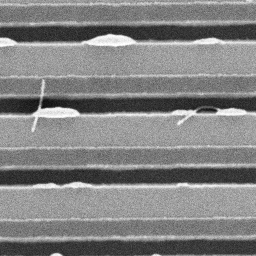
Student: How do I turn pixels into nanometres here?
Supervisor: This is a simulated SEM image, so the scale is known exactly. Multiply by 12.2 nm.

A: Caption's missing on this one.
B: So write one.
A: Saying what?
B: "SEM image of lines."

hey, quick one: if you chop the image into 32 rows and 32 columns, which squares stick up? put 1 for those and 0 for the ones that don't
11111111111111111111111111111111
11111111111111111111111111111111
11111111111111111111111111111111
00000000000000000000000000000000
00000000000001110000000000000000
11100001011111111111111111111111
11111111111111111111111111111111
11111111111111111111111111111111
11111111111111111111111111111111
11111111111111111111111111111111
11111111111111111111111111111111
11111111111111111111111111111111
00000000000000000000000000000000
00000111000000000000000000000000
11101111111111111111111111111111
11111111111111111111111111111111
11111111111111111111111111111111
11111111111111111111111111111111
11111111111111111111111111111111
11111111111111111111111111111111
11111111111111111111111111111111
00000000000000000000000000000000
00000000000000000000000000000000
11111111111111111111111111111111
11111111111111111111111111111111
11111111111111111111111111111111
11111111111111111111111111111111
11111111111111111111111111111111
11111111111111111111111111111111
11111111111111111111111111111111
00000000000000000000000000000000
00000000000000000000000000000000